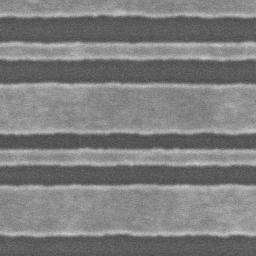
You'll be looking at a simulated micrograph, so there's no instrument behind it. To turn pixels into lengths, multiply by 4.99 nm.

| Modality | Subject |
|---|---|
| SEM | lines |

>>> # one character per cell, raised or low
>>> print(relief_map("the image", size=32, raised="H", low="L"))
HHHHHHHHHHHHHHHHHHHHHHHHHHHHHHHH
HHHHHHHHHHHHHHHHHHHHHHHHHHHHHHHH
LLLLLLLLLLLLLLLLLLLLLLLLLLLLLLLL
LLLLLLLLLLLLLLLLLLLLLLLLLLLLLLLL
LLLLLLLLLLLLLLLLLLLLLLLLLLLLLLLL
HHHHHHHHHHHHHHHHLHHHHHHHHHHHHHHH
HHHHHHHHHHHHHHHHHHHHHHHHHHHHHHHH
LLLLLLLLLLLLLLLLLLLLLLLLLLLLLLLL
LLLLLLLLLLLLLLLLLLLLLLLLLLLLLLLL
LLLLLLLLLLLLLLLLLLLLLLLLLLLLLLLL
LLLLLHHHLLLLLHHLLLLLLLLLLLLLLLLL
HHHHHHHHHHHHHHHHHHHHHHHHHHHHHHHH
HHHHHHHHHHHHHHHHHHHHHHHHHHHHHHHH
HHHHHHHHHHHHHHHHHHHHHHHHHHHHHHHH
HHHHHHHHHHHHHHHHHHHHHHHHHHHHHHHH
HHHHHHHHHHHHHHHHHHHHHHHHHHHHHHHH
HHHHHHHLLHHHHHLLHHHHHLHHHLLHHHHH
LLLLLLLLLLLLLLLLLLLLLLLLLLLLLLLL
LLLLLLLLLLLLLLLLLLLLLLLLLLLLLLLL
HHHHHHHHHHHHHHHHHHHHHHHHHHHHHHHH
HHLLLLLHHHLHHHHLHLLLLHHHHHHHHLLH
LLLLLLLLLLLLLLLLLLLLLLLLLLLLLLLL
LLLLLLLLLLLLLLLLLLLLLLLLLLLLLLLL
HHHHHHHHHHHHHHHHHHHHHHHHHHHHHHHH
HHHHHHHHHHHHHHHHHHHHHHHHHHHHHHHH
HHHHHHHHHHHHHHHHHHHHHHHHHHHHHHHH
HHHHHHHHHHHHHHHHHHHHHHHHHHHHHHHH
HHHHHHHHHHHHHHHHHHHHHHHHHHHHHHHH
HHHHHHHHHHHHHHHHHHHHHHHHHHHHHHHH
LLLLLLLLLLLLLLLLLLLLLLLLLLLLLLLL
LLLLLLLLLLLLLLLLLLLLLLLLLLLLLLLL
LLLLLLLLLLLLLLLLLLLLLLLLLLLLLLLL